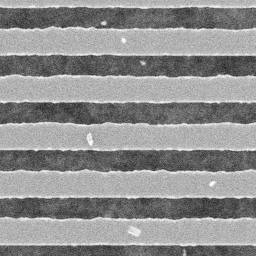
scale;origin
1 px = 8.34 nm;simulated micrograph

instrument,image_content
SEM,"lines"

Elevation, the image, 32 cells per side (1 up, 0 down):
11111111111111111111111111111111
00000000000000000000000000000000
00000000000000000000000000000000
00000010110100000000001000000000
11111111111111111111111111111111
11111111111111111111111111111111
11111111111111111111111111111111
00000000000000000000000000000000
00000000000000000000000000000000
01100001100000000000000000011000
11111111111111111111111111111111
11111111111111111111111111111111
11111111111111111111111111111111
00000000000000000000000000000000
00000000000000000000000000000000
01111111110011111100000101111101
11111111111111111111111111111111
11111111111111111111111111111111
11111111111111111111111111111111
00000000000000000000000000000000
00000000000000000000000000000000
11111111111110111111101111010111
11111111111111111111111111111111
11111111111111111111111111111111
11111111111111111111111111111111
00000000000000000000000000000000
00000000000000000000000000000000
11111110111111111111101111111111
11111111111111111111111111111111
11111111111111111111111111111111
11111111111111111111111111111111
00000000000000000000000000000000